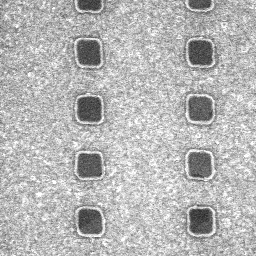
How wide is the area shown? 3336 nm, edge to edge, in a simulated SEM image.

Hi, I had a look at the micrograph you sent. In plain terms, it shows a regular array of raised bodies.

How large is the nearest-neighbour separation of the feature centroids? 731 nm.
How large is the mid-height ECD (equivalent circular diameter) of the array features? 390 nanometres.